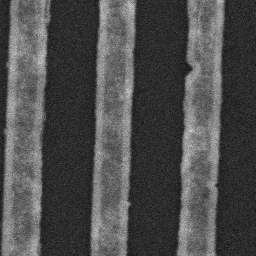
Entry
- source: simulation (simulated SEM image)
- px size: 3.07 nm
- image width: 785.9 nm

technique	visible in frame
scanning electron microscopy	one or a few lines or trenches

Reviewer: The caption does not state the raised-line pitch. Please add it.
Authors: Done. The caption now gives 271 nanometers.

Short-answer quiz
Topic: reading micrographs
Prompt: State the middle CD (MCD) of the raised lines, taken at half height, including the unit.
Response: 87.3 nanometres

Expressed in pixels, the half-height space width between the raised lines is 59.6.